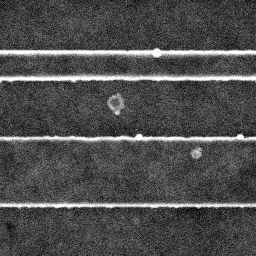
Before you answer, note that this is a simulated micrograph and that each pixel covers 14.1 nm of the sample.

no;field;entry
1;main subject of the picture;lines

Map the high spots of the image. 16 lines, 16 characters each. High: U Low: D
DDDDDDDDDDDDDDDD
DDDDDDDDDDDDDDDD
DDDDDDDDDDDDDDDD
UUUUUUUUUUUUUUUU
UUUUUUUUUUUUUUUU
DDDDDDDDDDDDDDDD
DDDDDDDDDDDDDDDD
DDDDDDDDDDDDDDDD
DDDDDDDDDDDDDDDD
UUUUUUUUUUUUUUUU
UUUUUUUUUUUUUUUU
UUUUUUUUUUUUUUUU
UUUUUUUUUUUUUUUU
DDDDDDDDDDDDDDDD
DDDDDDDDDDDDDDDD
DDDDDDDDDDDDDDDD